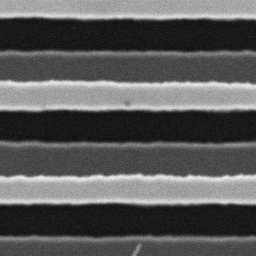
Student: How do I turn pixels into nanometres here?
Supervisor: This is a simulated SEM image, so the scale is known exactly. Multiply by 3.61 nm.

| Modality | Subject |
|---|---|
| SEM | lines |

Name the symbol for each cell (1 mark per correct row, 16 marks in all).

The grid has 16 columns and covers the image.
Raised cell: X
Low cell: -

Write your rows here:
XXXXXXXXXXXXXXXX
----------------
----------------
XXXXXXXXXXXXXXXX
XXXXXXXXXXXXXXXX
XXXXXXXXXXXXXXXX
XXXXXXXXXXXXXXXX
----------------
----------------
XXXXXXXXXXXXXXXX
XXXXXXXXXXXXXXXX
XXXXXXXXXXXXXXXX
XXXXXXXXXXXXXXXX
----------------
----------------
XXXXXXXXXXXXXXXX